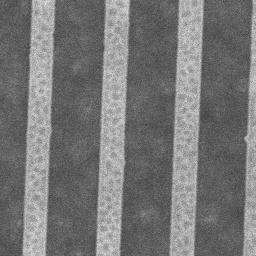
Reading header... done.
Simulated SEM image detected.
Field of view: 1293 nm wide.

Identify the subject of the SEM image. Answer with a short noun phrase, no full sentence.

one or a few lines or trenches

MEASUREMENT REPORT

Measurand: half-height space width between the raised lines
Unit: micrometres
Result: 0.26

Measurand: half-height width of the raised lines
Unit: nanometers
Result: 110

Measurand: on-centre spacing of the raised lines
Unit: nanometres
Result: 373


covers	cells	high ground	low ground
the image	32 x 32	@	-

----@@@------@@@-------@@-------
----@@@------@@@-------@@-------
----@@@------@@@-------@@-------
----@@@------@@@-------@@-------
----@@@------@@@------@@@-------
----@@@------@@@------@@@-------
----@@-------@@@------@@@------@
----@@-------@@@------@@@-------
----@@-------@@@------@@@------@
----@@-------@@@------@@@------@
----@@-------@@@------@@@------@
----@@-------@@@------@@@------@
----@@-------@@@------@@@------@
----@@-------@@@------@@@------@
----@@-------@@-------@@@------@
----@@-------@@-------@@@------@
---@@@-------@@-------@@@------@
----@@-------@@-------@@@------@
----@@-------@@-------@@@------@
---@@@-------@@-------@@@------@
---@@@-------@@-------@@@------@
---@@@-------@@-------@@-------@
---@@@-------@@-------@@-------@
---@@@------@@@-------@@-------@
---@@@------@@@-------@@-------@
---@@@------@@@-------@@-------@
---@@@------@@@-------@@-------@
---@@@------@@@-------@@-------@
---@@@------@@@------@@@-------@
---@@@------@@@------@@@-------@
---@@@------@@@------@@@-------@
---@@@------@@@------@@@-------@